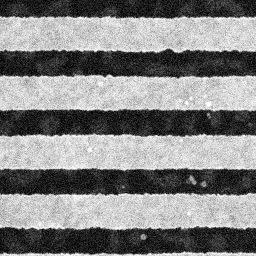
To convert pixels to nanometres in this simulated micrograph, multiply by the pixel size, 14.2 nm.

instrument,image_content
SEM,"parallel lines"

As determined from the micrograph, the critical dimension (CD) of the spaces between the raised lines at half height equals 379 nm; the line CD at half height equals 458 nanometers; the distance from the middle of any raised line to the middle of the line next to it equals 840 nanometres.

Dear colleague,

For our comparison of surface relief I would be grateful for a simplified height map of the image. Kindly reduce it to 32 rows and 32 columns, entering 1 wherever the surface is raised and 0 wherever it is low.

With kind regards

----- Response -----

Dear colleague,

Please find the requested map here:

00000000000000000000000000000000
00000000000000000000000000000000
11111111111111111111111111111111
11111111111111111111111111111111
11111111111111111111111111111111
11111111111111111111111111111111
00000000000000000000000000000000
00000000000000000000000000000000
00000000000000000000000000000000
00000000000000000000000000000000
11111111111111111111111111111111
11111111111111111111111111111111
11111111111111111111111111111111
11111111111111111111111111111111
00000000000000000000000000000000
00000000000000000000000000000000
00000000000000000000000000000000
11111111111111111111111111111111
11111111111111111111111111111111
11111111111111111111111111111111
11111111111111111111111111111111
00000000000000000000000000000000
00000000000000000000000000000000
00000000000000000000000000000000
11111111111111111111111111110111
11111111111111111111111111111111
11111111111111111111111111111111
11111111111111111111111111111111
00000000011000110000000000000000
00000000000000000000000000000000
00000000000000000000000000000000
00000000000000000000000000000000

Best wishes